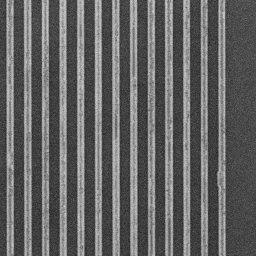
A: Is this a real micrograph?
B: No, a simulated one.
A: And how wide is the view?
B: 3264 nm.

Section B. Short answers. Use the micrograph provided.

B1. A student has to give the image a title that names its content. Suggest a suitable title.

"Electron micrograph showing parallel lines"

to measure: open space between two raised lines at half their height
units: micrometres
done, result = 0.167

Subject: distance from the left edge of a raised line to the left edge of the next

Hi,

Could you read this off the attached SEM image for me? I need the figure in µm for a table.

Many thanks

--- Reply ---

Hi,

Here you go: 0.225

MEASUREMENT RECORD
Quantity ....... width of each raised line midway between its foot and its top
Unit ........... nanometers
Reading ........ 59